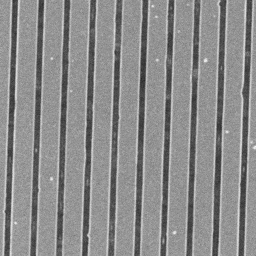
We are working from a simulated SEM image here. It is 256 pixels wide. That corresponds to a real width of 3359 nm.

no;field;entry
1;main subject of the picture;parallel lines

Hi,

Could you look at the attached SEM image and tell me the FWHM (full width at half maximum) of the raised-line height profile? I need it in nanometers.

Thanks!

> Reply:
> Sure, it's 259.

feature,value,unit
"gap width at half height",78.7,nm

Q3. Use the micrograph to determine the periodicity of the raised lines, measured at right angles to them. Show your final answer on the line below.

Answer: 341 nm